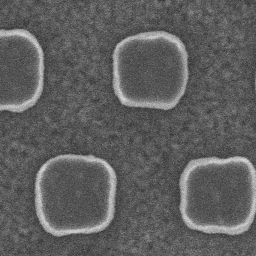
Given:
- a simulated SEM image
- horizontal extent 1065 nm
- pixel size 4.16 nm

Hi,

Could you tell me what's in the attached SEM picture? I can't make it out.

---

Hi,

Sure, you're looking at raised bodies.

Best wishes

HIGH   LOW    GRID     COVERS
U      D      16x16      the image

DDDDDDDDDDDDDDDD
DDDDDDDDDDDDDDDD
UUDDDDDDUUUDDDDD
UUUDDDDUUUUUDDDD
UUUDDDDUUUUUDDDD
UUUDDDDUUUUUDDDD
UUDDDDDDUUUDDDDD
DDDDDDDDDDDDDDDD
DDDDDDDDDDDDDDDD
DDDDDDDDDDDDDDDD
DDDUUUUDDDDDUUUU
DDUUUUUDDDDUUUUU
DDUUUUUDDDDUUUUU
DDUUUUUDDDDUUUUU
DDDUUUDDDDDDDUUD
DDDDDDDDDDDDDDDD